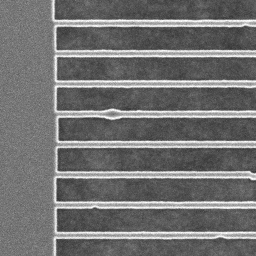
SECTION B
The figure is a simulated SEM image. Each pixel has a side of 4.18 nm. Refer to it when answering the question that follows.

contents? parallel lines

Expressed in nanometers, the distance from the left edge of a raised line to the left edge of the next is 126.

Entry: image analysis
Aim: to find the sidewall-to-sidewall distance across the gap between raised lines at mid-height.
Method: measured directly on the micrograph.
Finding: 102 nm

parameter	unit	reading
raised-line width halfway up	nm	24.5